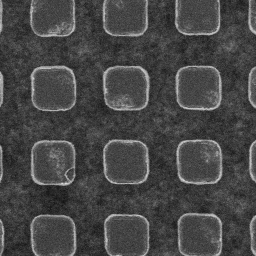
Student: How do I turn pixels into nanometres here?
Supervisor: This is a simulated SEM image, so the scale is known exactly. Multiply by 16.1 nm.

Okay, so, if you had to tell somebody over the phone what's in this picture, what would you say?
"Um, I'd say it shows raised bodies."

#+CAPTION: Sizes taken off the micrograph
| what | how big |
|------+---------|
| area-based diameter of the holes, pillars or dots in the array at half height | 766 nanometers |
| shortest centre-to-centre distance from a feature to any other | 1170 nm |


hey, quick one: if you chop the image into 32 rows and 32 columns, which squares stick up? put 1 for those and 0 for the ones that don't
00001111100001111100001111100001
00001111100001111100001111100001
00001111100001111100001111100001
00001111100001111100001111100001
00000100000000000000000000000000
00000000000000000000000000000000
00000000000000000000000000000000
00000000000000000000000000000000
00000111000000111100000111100000
00001111100001111100001111100001
00001111100001111100001111110001
00001111100001111100001111100001
00001111100001111100001111100001
00000111100000111100000111100000
00000000000000000000000000000000
00000000000000000000000000000000
00000000000000000000000000000000
00000000000000000000000000000000
00001111100001111100001111110001
00001111100001111100001111110001
00001111100001111100001111110001
00001111100001111100001111110001
00001111100000111100000111100000
00000000000000000000000000000000
00000000000000000000000000000000
00000000000000000000000000000000
00000000000000000000000000000000
00001111100001111100001111100000
00001111100001111110001111110001
00001111100001111110001111110001
00001111100001111110001111110001
00001111100001111100000111100000